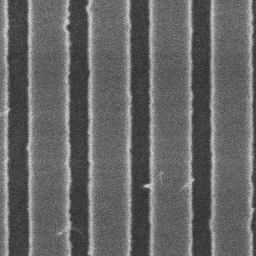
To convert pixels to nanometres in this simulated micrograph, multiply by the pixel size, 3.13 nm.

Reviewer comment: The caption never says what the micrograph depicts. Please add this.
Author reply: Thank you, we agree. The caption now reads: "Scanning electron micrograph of one or a few lines or trenches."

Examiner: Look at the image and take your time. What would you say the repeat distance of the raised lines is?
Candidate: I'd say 191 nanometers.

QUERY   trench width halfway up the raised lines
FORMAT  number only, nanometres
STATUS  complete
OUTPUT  67.3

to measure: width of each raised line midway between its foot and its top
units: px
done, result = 39.5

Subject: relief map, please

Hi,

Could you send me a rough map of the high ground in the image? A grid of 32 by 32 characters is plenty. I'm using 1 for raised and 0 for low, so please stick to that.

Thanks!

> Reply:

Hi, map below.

10001111100111110001111100011110
10001111100111110001111100111110
10001111000111110001111100111110
10001111000111110001111100011110
10001111100111110001111100011110
10001111000111110001111100011110
10001111100111110001111100011110
10001111100111110001111100111110
10001111100111110001111100111110
10001111000111110001111100011110
10001111000111110001111100011110
10001111100111110001111100011110
10001111100111110001111100111110
10001111100111110001111100111110
10001111000111110001111100111110
10001111100111110001111100011110
10001111100111110001111100011110
10001111000111110001111100011110
10001111100111110001111100011110
10001111100111110001111100011110
10001111000111110001111100011110
10001111100111110001111100011110
10001111100111110001111100011110
10001111100111110001111100011111
10001111100111110001111100011110
10001111100111110001111100011110
10001111000111110001111100011111
10001111100111110001111100111110
10001111100111110001111100111110
10001111100111110001111100011110
10001111100111110001111100011110
10001111100111110001111100011110